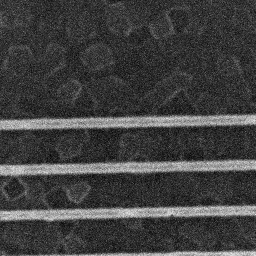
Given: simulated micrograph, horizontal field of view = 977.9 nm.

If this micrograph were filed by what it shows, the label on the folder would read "parallel lines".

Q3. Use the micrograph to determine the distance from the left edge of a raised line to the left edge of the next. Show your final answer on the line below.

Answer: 173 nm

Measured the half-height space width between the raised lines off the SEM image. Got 144 nanometres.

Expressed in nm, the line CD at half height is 29.1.